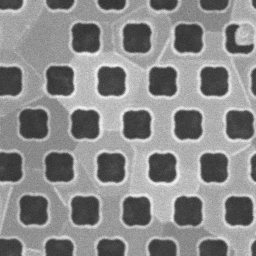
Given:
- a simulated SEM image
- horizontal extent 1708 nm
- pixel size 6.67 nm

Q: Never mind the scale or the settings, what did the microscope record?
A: a regular array of holes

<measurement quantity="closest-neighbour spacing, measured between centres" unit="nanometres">334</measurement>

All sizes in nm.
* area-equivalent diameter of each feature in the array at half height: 227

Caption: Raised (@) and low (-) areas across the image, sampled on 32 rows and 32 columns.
---@@@---@@@----@@@---@@@----@@-
@@@@@@@@@@@@@@@@@@@@@@@@@@@@@@@@
@@@@@@@@@@@@@@@@@@@@@@@@@@@@@@@@
@@@@@@@@@----@@----@@@---@@@--@-
@@@@@@@@@----@@----@@@---@@@--@-
@@@@@@@@@----@@----@@@---@@@----
@@@@@@@@@---@@@@---@@@---@@@----
@@@@@@@@@@@@@@@@@@@@@@@@@@@@@@@@
---@@@---@@@---@@@@---@@@---@@@@
---@@@---@@@----@@----@@@----@@-
---@@@---@@@----@@----@@@----@@-
---@@@---@@@----@@@---@@@----@@-
@@@@@@@@@@@@@@@@@@@@@@@@@@@@@@@@
@@@@@@@@@@@@@@@@@@@@@@@@@@@@@@@@
@@----@@@----@@----@@@---@@@----
@@----@@@----@@----@@@---@@@----
@@----@@@----@@----@@@---@@@----
@@@@@@@@@@--@@@@--@@@@@@-@@@@--@
@@@@@@@@@@@@@@@@@@@@@@@@@@@@@@@@
---@@@---@@@---@@@@---@@@---@@@-
---@@@---@@@----@@----@@@----@@-
---@@@---@@@----@@----@@@----@@-
---@@@---@@@---@@@@---@@@---@@@-
@@@@@@@@@@@@@@@@@@@@@@@@@@@@@@@@
@@@---@@@---@@@@--@@@@@--@@@@--@
@@----@@@----@@----@@@---@@@----
@@----@@@----@@----@@@---@@@----
@@----@@@----@@----@@@---@@@----
@@@@@@@@@@@@@@@@@@@@@@@@@@@@@@@@
@@@@@@@@@@@@@@@@@@@@@@@@@@@@@@@@
---@@@---@@@----@@----@@@----@@-
---@@----@@@----@@----@@@----@@-